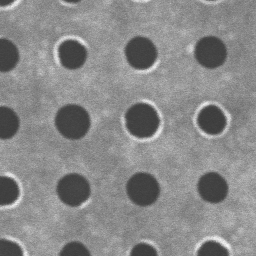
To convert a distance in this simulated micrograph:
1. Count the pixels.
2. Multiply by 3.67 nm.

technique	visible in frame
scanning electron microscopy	a regular array of holes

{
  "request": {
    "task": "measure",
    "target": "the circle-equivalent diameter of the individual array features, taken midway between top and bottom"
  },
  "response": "122 nanometers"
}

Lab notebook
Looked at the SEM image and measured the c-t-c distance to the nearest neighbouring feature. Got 249 nanometers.